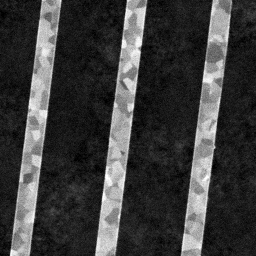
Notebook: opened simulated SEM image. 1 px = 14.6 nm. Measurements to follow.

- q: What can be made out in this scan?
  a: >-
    one or a few lines or trenches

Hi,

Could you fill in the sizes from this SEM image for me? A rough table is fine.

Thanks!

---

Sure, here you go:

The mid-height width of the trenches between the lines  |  0.965 micrometres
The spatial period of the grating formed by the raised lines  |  1240 nm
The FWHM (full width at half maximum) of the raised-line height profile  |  275 nm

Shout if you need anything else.